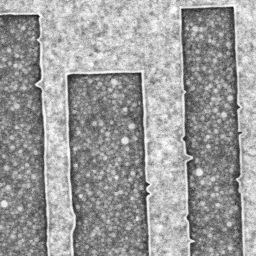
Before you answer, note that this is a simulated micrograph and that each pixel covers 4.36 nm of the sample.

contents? one or a few lines or trenches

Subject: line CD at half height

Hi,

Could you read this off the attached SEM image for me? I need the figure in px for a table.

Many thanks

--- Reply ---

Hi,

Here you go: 34.7